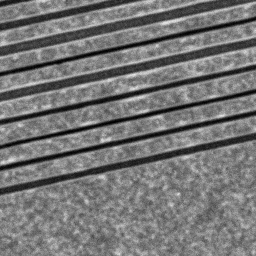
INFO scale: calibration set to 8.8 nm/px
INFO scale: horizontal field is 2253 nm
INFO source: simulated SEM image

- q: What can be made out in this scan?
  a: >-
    parallel lines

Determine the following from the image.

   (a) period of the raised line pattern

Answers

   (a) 200 nanometres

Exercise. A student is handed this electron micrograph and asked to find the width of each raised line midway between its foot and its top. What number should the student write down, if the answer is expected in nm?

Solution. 136